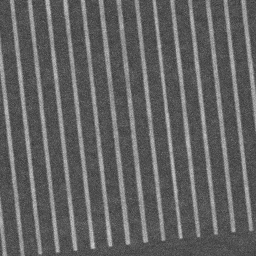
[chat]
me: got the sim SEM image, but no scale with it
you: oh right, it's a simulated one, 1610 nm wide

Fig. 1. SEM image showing parallel lines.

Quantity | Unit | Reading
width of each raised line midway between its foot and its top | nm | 21.8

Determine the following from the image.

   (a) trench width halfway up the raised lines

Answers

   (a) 0.089 micrometres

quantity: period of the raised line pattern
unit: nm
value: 111